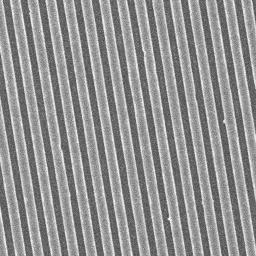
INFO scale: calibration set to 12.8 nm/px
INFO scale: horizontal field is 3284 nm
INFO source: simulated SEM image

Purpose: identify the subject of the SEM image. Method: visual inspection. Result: parallel lines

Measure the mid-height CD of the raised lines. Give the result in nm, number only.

120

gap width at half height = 98.1 nm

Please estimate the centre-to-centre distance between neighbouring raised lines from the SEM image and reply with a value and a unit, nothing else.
225 nm